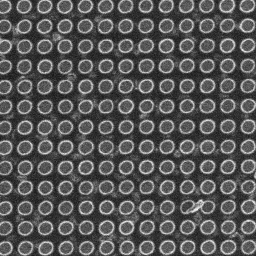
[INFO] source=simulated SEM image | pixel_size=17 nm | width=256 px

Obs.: a regular array of holes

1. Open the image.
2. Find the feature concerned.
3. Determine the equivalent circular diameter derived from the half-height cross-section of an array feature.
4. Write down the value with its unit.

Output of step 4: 212 nm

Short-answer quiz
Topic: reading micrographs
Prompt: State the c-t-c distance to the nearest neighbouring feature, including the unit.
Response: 339 nanometres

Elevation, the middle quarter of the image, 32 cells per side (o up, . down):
..oo...oo...oo...oo...oo...oo...
..oo...oo...oo...oo...oo...oo...
oooooooooooooooooooooooooooooooo
oooooooooooooooooooooooooooooooo
..oo...oo...ooo..ooo..ooo..ooo..
..oo...oo...oo...oo...oo...oo...
..oo...oo...oo...oo...oo...oo...
oooooooooooooooooooooooooooooooo
oooooooooooooooooooooooooooooooo
..ooo..ooo..ooo..ooo..ooo..ooo..
..oo...oo...oo...oo...oo...oo...
..oo...oo...oo...oo...oo...oo...
oooooooooooooooooooooooooooooooo
oooooooooooooooooooooooooooooooo
.oooo..ooo.oooo..ooo..ooo..ooo..
..oo...oo...oo...oo...oo...oo...
..oo...oo...oo...oo...oo...oo...
oooooooooooooooooooooooooooooooo
oooooooooooooooooooooooooooooooo
.oooo.oooo.oooo..ooo..ooo..ooo..
..oo...oo...oo...oo...oo...oo...
..oo...oo...oo...oo...oo...oo...
oooooooooooooooooooooooooooooooo
oooooooooooooooooooooooooooooooo
.oooo..ooo.oooo.oooo..ooo..ooo.o
..oo...oo...oo...oo...oo...oo...
..oo...oo...oo...oo...oo...oo...
oooooooooooooooooooooooooooooooo
oooooooooooooooooooooooooooooooo
.oooo.oooo.oooo..ooo..ooo..ooo..
..oo...oo...oo...oo...oo...oo...
..oo...oo...oo...oo...oo...oo...